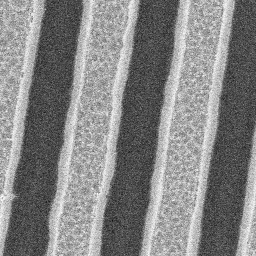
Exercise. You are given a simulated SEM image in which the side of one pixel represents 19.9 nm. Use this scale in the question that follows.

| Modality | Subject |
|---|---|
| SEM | one or a few lines or trenches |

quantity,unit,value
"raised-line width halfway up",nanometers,869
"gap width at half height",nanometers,1000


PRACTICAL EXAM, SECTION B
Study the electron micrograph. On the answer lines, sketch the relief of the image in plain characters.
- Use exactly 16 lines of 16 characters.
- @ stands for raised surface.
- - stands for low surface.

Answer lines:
@@----@@---@@@--
@@---@@@---@@@--
@@---@@@---@@@--
@@---@@@---@@@--
@@---@@@---@@@--
@@---@@----@@---
@----@@----@@---
@---@@@---@@@---
@---@@@---@@@---
@---@@@---@@@---
@---@@@---@@@---
@---@@@---@@@---
----@@----@@@---
---@@@---@@@---@
---@@@---@@@---@
---@@@---@@@---@